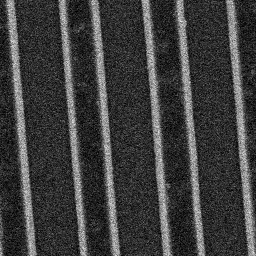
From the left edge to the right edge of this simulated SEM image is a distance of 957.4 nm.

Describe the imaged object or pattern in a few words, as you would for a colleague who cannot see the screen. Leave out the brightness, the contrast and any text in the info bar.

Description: one or a few lines or trenches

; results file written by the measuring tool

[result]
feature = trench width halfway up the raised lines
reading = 182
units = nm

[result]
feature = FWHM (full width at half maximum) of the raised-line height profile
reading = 131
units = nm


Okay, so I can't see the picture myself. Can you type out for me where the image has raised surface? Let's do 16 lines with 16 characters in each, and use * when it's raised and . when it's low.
*...**...**...**
*...**...**...**
*...**...**...**
*...**...***...*
*...**...***...*
*...**....**...*
*...***...**...*
*...***...**...*
*....**...**...*
**...**...**...*
**...**...**...*
**...**...**...*
**...**...**...*
**...**...**...*
**...**...***...
**...**...***...